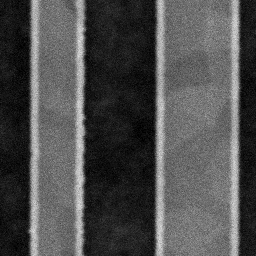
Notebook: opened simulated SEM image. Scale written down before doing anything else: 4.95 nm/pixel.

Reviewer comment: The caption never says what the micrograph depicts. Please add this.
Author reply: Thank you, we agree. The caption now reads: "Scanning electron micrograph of one or a few lines or trenches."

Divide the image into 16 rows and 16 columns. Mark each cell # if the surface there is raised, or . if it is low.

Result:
..###.....#####.
..###.....#####.
..###.....#####.
..###.....#####.
..###.....#####.
..###.....#####.
..###.....#####.
..###.....#####.
..###.....#####.
..###.....#####.
..###.....#####.
..###.....#####.
..###.....#####.
..###.....#####.
..###.....#####.
..###.....#####.